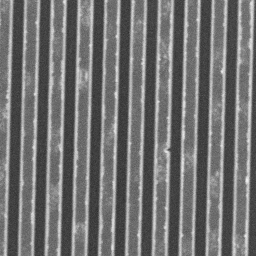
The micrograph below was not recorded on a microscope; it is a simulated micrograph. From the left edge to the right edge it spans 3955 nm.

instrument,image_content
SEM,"parallel lines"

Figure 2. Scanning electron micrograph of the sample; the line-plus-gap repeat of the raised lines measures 413 nanometres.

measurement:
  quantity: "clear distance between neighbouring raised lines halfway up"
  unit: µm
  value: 0.197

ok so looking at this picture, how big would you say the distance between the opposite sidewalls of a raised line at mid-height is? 0.212 microns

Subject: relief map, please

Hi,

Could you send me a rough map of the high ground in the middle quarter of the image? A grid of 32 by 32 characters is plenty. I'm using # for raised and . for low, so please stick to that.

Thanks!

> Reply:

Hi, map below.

...####...###....###...####...##
...####...###....###...####...##
...####...###....###...####...##
...###....###....###...####...##
...###....###....###...####...##
...###....###....###...####...##
...###....###....###...####...##
...###....###....###...####...##
...###....###....###...###....##
...###....###....###...###....##
...###....###....###...###....##
...###....###....###...###....##
...###....###....###...###....##
...###....###....###...###....##
...###....###....###...###....##
...###....###...####...###....##
...###....###...####...###....##
...###....###...####...###....##
...###....###...####...###....##
...###....###...####...###....##
...###...####...####...###....##
...###...####...####...###....##
...###...####...####...###....##
...###...####...###....###....##
...###...####...###....###....##
...###...####...###....###...###
...###...####...###....###...###
...###...####...###....###...###
...###...####...###....###...###
...###...####...###....###...###
...###...####...###....###...###
...###...####...###....###...###